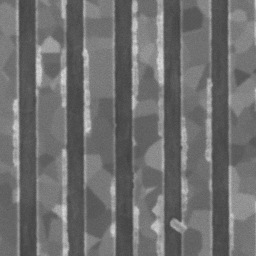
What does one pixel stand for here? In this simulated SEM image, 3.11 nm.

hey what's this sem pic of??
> parallel lines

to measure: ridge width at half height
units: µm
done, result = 0.0944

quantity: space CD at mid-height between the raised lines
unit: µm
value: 0.0552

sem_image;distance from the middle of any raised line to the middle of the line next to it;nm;150